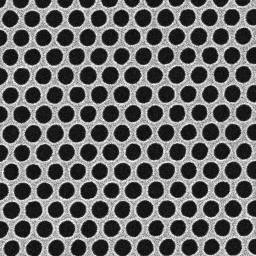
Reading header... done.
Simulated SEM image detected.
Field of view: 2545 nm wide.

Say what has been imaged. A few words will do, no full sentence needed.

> a regular array of holes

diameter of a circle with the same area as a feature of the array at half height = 167 nanometres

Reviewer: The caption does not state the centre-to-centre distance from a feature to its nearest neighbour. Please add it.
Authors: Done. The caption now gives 0.217 um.